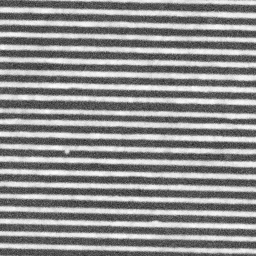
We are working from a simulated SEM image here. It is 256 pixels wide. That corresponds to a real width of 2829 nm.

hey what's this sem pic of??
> parallel lines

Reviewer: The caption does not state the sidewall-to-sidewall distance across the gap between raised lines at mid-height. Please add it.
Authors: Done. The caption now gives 96.7 nanometers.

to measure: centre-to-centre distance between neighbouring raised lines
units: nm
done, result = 137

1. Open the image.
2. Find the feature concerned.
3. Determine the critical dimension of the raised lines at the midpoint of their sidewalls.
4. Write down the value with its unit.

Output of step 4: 40 nanometres